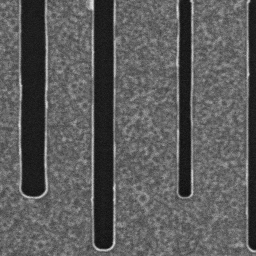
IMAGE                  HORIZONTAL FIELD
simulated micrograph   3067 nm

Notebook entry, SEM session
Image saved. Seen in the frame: one or a few lines or trenches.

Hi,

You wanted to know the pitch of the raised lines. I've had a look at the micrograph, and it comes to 901 nm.